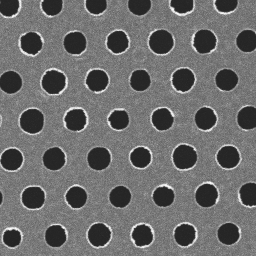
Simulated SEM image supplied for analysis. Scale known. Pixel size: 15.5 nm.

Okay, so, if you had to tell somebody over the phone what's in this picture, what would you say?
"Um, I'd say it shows a regular array of holes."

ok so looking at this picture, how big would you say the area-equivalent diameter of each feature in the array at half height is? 346 nanometres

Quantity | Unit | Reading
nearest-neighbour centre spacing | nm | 670